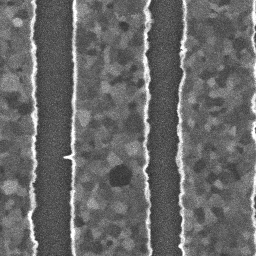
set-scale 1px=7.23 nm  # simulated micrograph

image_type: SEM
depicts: one or a few lines or trenches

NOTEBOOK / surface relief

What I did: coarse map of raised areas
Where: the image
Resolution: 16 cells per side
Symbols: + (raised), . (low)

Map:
++...++++...++++
++...++++...++++
++...++++..+++++
++...++++..+++++
++...++++..+++++
++...++++..+++++
++...++++..+++++
++...++++..+++++
++...++++..+++++
++..+++++..+++++
++...++++..+++++
++...++++..+++++
++..+++++..+++++
++..+++++..+++++
++...++++..+++++
++...++++..+++++